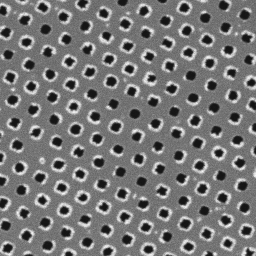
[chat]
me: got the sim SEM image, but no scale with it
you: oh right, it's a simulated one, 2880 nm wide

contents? a regular array of holes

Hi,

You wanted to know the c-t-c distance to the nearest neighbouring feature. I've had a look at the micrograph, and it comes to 249 nm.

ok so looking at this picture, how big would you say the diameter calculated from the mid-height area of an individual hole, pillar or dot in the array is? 0.109 microns